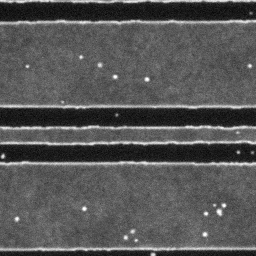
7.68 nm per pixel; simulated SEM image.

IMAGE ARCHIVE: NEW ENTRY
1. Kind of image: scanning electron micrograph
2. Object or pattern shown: lines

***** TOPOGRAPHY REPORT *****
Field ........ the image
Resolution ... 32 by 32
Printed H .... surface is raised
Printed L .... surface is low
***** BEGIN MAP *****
LLLLLLLLLLLLLLLLLLLLLLLLLLLLLLLL
LLLLLLLLLLLLLLLLLLLLLLLLLLLLLLLL
LLLLLLLLLLLLLLLLLLLLLLLLLLLLLLLL
HHHHHHHHHHHHHHHHHHHHHHHHHHHHHHHH
HHHHHHHHHHHHHHHHHHHHHHHHHHHHHHHH
HHHHHHHHHHHHHHHHHHHHHHHHHHHHHHHH
HHHHHHHHHHHHHHHHHHHHHHHHHHHHHHHH
HHHHHHHHHHHHHHHHHHHHHHHHHHHHHHHH
HHHHHHHHHHHHHHHHHHHHHHHHHHHHHHHH
HHHHHHHHHHHHHHHHHHHHHHHHHHHHHHHH
HHHHHHHHHHHHHHHHHHHHHHHHHHHHHHHH
HHHHHHHHHHHHHHHHHHHHHHHHHHHHHHHH
HHHHHHHHHHHHHHHHHHHHHHHHHHHHHHHH
LLLLLLLLLLLLLLLLLLLLLLLLLLLLLLLL
LLLLLLLLLLLLLLLLLLLLLLLLLLLLLLLL
LLLLLLLLLLLLLLLLLLLLLLLLLLLLLLLL
HHHHHHHHHHHHHHHHHHHHHHHHHHHHHHHH
HHHHHHHHHHHHHHHHHHHHHHHHHHHHHHHH
LLLLLLLLLLLLLLLLLLLLLLLLLLLLLLLL
LLLLLLLLLLLLLLLLLLLLLLLLLLLLLLLL
HHHHHHHHHHHHHHHHHHHHHHHHHHHHHHHH
HHHHHHHHHHHHHHHHHHHHHHHHHHHHHHHH
HHHHHHHHHHHHHHHHHHHHHHHHHHHHHHHH
HHHHHHHHHHHHHHHHHHHHHHHHHHHHHHHH
HHHHHHHHHHHHHHHHHHHHHHHHHHHHHHHH
HHHHHHHHHHHHHHHHHHHHHHHHHHHHHHHH
HHHHHHHHHHHHHHHHHHHHHHHHHHHHHHHH
HHHHHHHHHHHHHHHHHHHHHHHHHHHHHHHH
HHHHHHHHHHHHHHHHHHHHHHHHHHHHHHHH
HHHHHHHHHHHHHHHHHHHHHHHHHHHHHHHH
HHHHHHHHHHHHHHHHHHHHHHHHHHHHHHHH
LLLLLLLLLLLLLLLLLLLLLLLLLLLLLLLL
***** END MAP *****